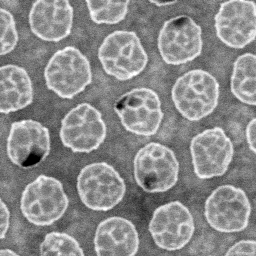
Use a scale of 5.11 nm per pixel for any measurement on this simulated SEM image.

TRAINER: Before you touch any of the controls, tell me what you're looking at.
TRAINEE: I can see a regular array of raised bodies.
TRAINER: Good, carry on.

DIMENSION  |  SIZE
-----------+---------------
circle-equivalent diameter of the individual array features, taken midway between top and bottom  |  231 nanometres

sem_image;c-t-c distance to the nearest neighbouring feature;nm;295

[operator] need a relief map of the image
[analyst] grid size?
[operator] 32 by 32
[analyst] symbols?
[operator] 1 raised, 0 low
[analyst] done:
00001111100111110000100000001111
10001111100111110000000000011111
11001111100011100000011100011111
11001111100000000000111110011111
11000111000000111000111110011111
11000000000001111000111110000110
10000001110011111100111110000000
00000011111001111100011000000011
11000011111001111100000000000111
11100011111000110000000111000111
11110011111000000000001111100111
11110001110000001110001111100111
11110000000000011111001111100011
11100000011100111111001111100000
00000000111100011111000111000000
00111000111110011111000000000001
01111100111110000110000000110001
01111100111110000000000011111001
01111100011100000011100011111001
01111100000000000111110011111000
00111000000010000111110011110000
00000000001111000111110001110000
00000110001111100111110000000000
00011111001111110011100000011000
00011111001111100000000000111110
00011111000111000000011000111110
10011111000000000001111100111110
10001110000000110001111100111110
10000000000011111001111100011100
00000011000011111001111100000000
00000111110011111000111000000011
10000111110011111000000000001111